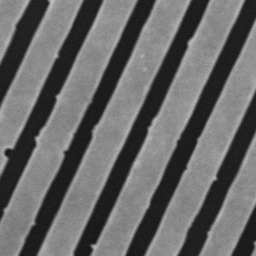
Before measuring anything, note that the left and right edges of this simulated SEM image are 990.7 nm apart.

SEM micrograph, parallel lines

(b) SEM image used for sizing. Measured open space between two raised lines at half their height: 68.7 nanometres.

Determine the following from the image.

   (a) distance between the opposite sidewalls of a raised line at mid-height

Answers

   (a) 120 nanometers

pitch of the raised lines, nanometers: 188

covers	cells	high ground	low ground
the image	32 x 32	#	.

####..####...####..#####..####..
###...####..#####..####...####..
##...####...####..#####..####...
##...####..#####..####...####...
##..####...####..#####..#####..#
#...####..#####..####...####...#
#..####...####...####..#####..##
...####..#####..####...####...##
..####...####...####..#####..###
..####...####..####...####...###
.#####..####...####..#####..####
.####..#####..#####..####...####
#####..####...####...####..####.
####...####..#####..####...####.
####..####...####...####..####..
###...####..#####..####...####..
###..####...####..#####..#####..
##..#####..#####..####...####...
#...####...####...####..#####..#
#...####..#####..####...####...#
#..#####..####...####..#####..##
...####...####..#####..####...##
..#####..####...####...####..###
..####...####..#####..####...###
..####..####...####...####..####
.####...####..#####..####...####
#####..#####..####...####..#####
####...####..#####..####...####.
####..#####..####...####..#####.
###...####..#####..####...####..
###..#####..####...####...####..
###..####...####..####...####...